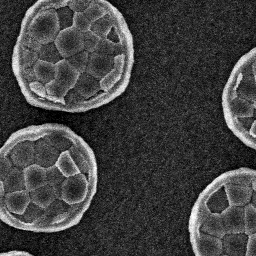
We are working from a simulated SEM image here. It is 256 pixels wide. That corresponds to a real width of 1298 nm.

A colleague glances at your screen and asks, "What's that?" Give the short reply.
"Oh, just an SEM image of raised bodies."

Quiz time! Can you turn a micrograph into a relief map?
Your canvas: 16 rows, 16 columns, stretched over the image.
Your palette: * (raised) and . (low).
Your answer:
..*****.........
.*******........
.*******........
.*******.......*
.*******.......*
.*******......**
..****........**
..............**
.****..........*
******..........
******..........
******.......***
******......****
*****.......****
............****
............****